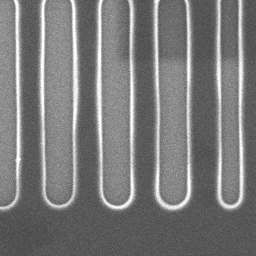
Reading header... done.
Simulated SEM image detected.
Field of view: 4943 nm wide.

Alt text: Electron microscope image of groups of lines, slits or small figures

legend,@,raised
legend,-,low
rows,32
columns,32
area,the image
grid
--@@@----@@@@---@@@@---@@@@---@@
--@@@----@@@----@@@@---@@@@---@@
--@@@----@@@----@@@@---@@@@---@@
--@@@----@@@----@@@@----@@@---@@
--@@@----@@@----@@@@----@@@---@@
--@@@----@@@----@@@@----@@@---@@
--@@@----@@@----@@@@----@@@---@@
--@@@----@@@----@@@@----@@@---@@
--@@@----@@@----@@@@----@@@---@@
--@@@----@@@----@@@@----@@@---@@
--@@@----@@@-----@@@---@@@@---@@
--@@@----@@@-----@@@---@@@@---@@
--@@@----@@@-----@@@---@@@@---@@
--@@@----@@@-----@@@---@@@@@--@@
--@@@----@@@-----@@@---@@@@@--@@
--@@@----@@@@----@@@---@@@@---@@
--@@@----@@@@---@@@@---@@@@@--@@
--@@@----@@@@---@@@@---@@@@@--@@
--@@@----@@@@---@@@@----@@@@--@@
--@@@----@@@@---@@@@----@@@@--@@
--@@@@---@@@@---@@@@----@@@@--@@
--@@@@---@@@@---@@@@----@@@---@@
--@@@@---@@@@----@@@----@@@---@@
--@@@@---@@@@----@@@----@@@---@@
--@@@@---@@@@---@@@@---@@@@@--@@
-@@@@@@-@@@@@@--@@@@---@@@@@--@@
@@@@@@@@@@@@@@@@@@@@@@@@@@@@@@@@
@@@@@@@@@@@@@@@@@@@@@@@@@@@@@@@@
@@@@@@@@@@@@@@@@@@@@@@@@@@@@@@@@
@@@@@@@@@@@@@@@@@@@@@@@@@@@@@@@@
@@@@@@@@@@@@@@@@@@@@@@@@@@@@@@@@
@@@@@@@@@@@@@@@@@@@@@@@@@@@@@@@@